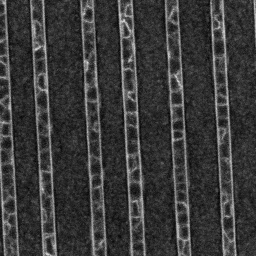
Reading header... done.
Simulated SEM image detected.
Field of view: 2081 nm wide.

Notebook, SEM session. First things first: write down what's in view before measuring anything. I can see parallel lines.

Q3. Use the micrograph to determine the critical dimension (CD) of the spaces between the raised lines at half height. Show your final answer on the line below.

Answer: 265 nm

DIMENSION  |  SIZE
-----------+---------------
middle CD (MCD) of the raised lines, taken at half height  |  108 nanometres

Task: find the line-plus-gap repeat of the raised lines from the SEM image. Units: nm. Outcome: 362